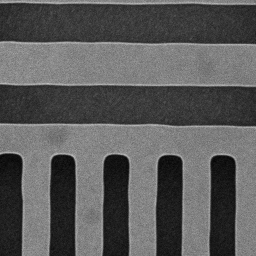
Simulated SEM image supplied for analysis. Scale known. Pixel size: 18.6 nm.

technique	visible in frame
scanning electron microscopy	groups of lines, slits or small figures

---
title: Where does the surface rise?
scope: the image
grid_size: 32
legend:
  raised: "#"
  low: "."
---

...........................#####
................................
................................
................................
................................
###################.#####.......
################################
################################
################################
################################
################################
................................
................................
................................
................................
................................
################################
################################
################################
..#####..#####..####..#####..###
...###...####...####...###...###
...###....###...####...###...###
...###....###...####...###...###
...###....###...####...###...###
...###....###...####...###....##
...###....###...###....###....##
...###....###...###....###...###
...###....###...###....###...###
...###....###...###....###...###
...###....###...###....###...###
...###....###...###....###...###
...###....###...###....###...###